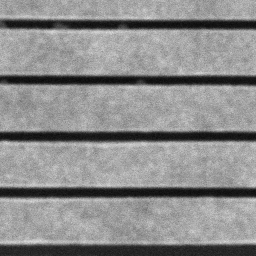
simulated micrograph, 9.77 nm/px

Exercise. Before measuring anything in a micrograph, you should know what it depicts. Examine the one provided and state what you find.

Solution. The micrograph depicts lines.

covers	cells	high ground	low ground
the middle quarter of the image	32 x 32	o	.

oooooooooooooooooooooooooooooooo
oooooooooooooooooooooooooooooooo
oooooooooooooooooooooooooooooooo
................................
................................
ooooooooooooooooo..ooo.o...oooo.
oooooooooooooooooooooooooooooooo
oooooooooooooooooooooooooooooooo
oooooooooooooooooooooooooooooooo
oooooooooooooooooooooooooooooooo
oooooooooooooooooooooooooooooooo
oooooooooooooooooooooooooooooooo
oooooooooooooooooooooooooooooooo
oooooooooooooooooooooooooooooooo
oooooooooooooooooooooooooooooooo
oooooooooooooooooooooooooooooooo
oooooooooooooooooooooooooooooooo
................................
................................
.....o............ooo.....oooooo
oooooooooooooooooooooooooooooooo
oooooooooooooooooooooooooooooooo
oooooooooooooooooooooooooooooooo
oooooooooooooooooooooooooooooooo
oooooooooooooooooooooooooooooooo
oooooooooooooooooooooooooooooooo
oooooooooooooooooooooooooooooooo
oooooooooooooooooooooooooooooooo
oooooooooooooooooooooooooooooooo
oooooooooooooooooooooooooooooooo
oooooooooooooooooooooooooooooooo
................................